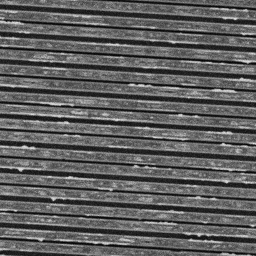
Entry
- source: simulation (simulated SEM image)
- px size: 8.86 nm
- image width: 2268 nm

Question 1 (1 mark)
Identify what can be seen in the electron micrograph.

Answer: parallel lines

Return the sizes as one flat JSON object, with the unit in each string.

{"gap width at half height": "38.1 nm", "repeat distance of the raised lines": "121 nanometres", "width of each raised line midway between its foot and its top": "82.9 nm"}